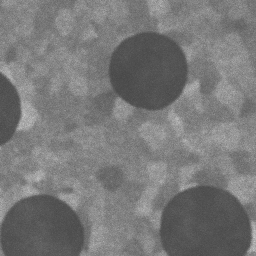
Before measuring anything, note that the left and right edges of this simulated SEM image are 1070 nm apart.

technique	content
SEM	holes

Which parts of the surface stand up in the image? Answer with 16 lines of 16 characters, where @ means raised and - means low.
@@@@@@@@@@@@@@@@
@@@@@@@@@@@@@@@@
@@@@@@@@---@@@@@
@@@@@@@-----@@@@
@@@@@@@-----@@@@
-@@@@@@-----@@@@
-@@@@@@@---@@@@@
-@@@@@@@@@@@@@@@
-@@@@@@@@@@@@@@@
@@@@@@@@@@@@@@@@
@@@@@@@@@@@@@@@@
@@@@@@@@@@@@@@@@
@---@@@@@@@----@
-----@@@@@-----@
-----@@@@@------
-----@@@@@------